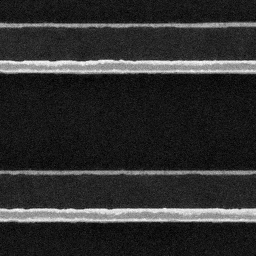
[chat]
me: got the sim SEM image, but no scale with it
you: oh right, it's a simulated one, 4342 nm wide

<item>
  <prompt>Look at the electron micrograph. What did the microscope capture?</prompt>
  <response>lines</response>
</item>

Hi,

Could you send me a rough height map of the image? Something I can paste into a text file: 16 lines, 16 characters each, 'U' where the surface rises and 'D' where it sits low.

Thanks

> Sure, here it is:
DDDDDDDDDDDDDDDD
DDDDDDDDDDDDDDDD
UUUUUUUUUUUUUUUU
UUUUUUUUUUUUUUUU
DDDDDUDUDDDDDDDD
DDDDDDDDDDDDDDDD
DDDDDDDDDDDDDDDD
DDDDDDDDDDDDDDDD
DDDDDDDDDDDDDDDD
DDDDDDDDDDDDDDDD
DDDDDDDDDDDDDDDD
UUUUUUUUUUUUUUUU
UUUUUUUUUUUUUUUU
UUUUUUUUUUUUUUUU
DDDDDDDDDDDDDDDD
DDDDDDDDDDDDDDDD